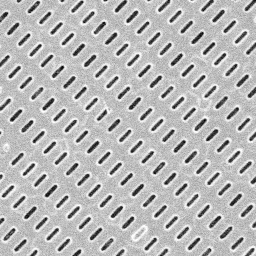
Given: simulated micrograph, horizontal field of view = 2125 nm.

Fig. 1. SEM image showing a regular array of holes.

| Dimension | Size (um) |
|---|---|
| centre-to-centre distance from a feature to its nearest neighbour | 0.128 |